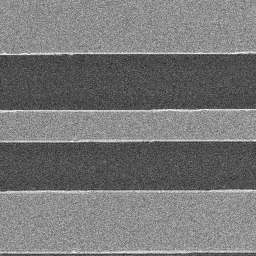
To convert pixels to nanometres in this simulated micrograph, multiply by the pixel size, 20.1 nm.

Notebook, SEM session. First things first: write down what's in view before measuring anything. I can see lines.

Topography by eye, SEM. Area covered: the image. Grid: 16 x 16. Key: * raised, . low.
****************
****************
****************
................
................
................
................
****************
****************
................
................
................
****************
****************
****************
****************